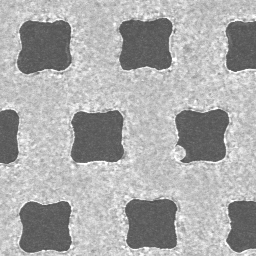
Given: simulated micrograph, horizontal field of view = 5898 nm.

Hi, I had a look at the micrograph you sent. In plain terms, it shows holes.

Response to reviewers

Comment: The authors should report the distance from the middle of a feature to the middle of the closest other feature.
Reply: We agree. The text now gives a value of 2.36 micrometres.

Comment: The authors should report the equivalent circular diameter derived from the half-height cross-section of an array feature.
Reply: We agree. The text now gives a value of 1300 nanometres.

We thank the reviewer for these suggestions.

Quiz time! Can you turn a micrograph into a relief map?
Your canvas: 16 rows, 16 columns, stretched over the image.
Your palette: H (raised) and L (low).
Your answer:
HHHHHHHHHHHHHHHH
HHLLHHHHLLLHHHLL
HLLLHHHHLLLHHHLL
HLLLHHHHLLLHHHLL
HLHHHHHHHHHHHHHH
HHHHHHHHHHHHHHHH
HHHHHHHHHHHHHHHH
LHHHHLLLHHHLLLHH
LHHHHLLLHHHLLLHH
LHHHLLLLHHHLLLHH
HHHHHHHHHHHHHHHH
HHHHHHHHHHHHHHHH
HHHHHHHHLLLHHHHH
HLLLHHHHLLLHHHLL
HLLLHHHHLLLHHHLL
HLLLHHHHLLLHHHLL